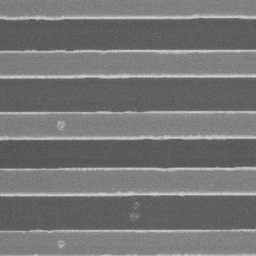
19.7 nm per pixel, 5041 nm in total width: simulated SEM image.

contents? lines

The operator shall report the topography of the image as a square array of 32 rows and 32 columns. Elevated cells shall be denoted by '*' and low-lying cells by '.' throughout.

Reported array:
********************************
********************************
................................
................................
................................
................................
********************************
********************************
********************************
********************************
................................
................................
................................
................................
********************************
********************************
********************************
*...............................
................................
................................
................................
********************************
********************************
********************************
................................
................................
................................
................................
................................
********************************
********************************
********************************